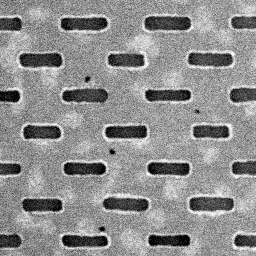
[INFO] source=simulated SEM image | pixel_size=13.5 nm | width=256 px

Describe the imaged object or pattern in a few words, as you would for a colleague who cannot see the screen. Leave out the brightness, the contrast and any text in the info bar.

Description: a regular array of holes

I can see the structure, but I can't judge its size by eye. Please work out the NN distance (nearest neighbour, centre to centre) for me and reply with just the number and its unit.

55.2 pixels